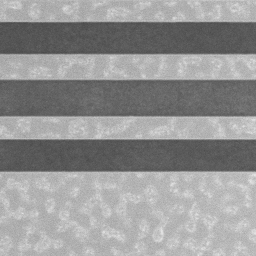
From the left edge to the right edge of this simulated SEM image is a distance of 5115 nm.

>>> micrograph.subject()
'parallel lines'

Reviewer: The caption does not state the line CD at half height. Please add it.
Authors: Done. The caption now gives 0.494 um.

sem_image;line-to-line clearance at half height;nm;639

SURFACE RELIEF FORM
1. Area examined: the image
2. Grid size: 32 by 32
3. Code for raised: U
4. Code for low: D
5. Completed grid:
UUUUUUUUUUUUUUUUUUUUUUUUUUUUUUUU
UUUUUUUUUUUUUUUUUUUUUUUUUUUUUUUU
UUUUUUUUUUUUUUUUUUUUUUUUUUUUUUUU
DDDDDDDDDDDDDDDDDDDDDDDDDDDDDDDD
DDDDDDDDDDDDDDDDDDDDDDDDDDDDDDDD
DDDDDDDDDDDDDDDDDDDDDDDDDDDDDDDD
DDDDDDDDDDDDDDDDDDDDDDDDDDDDDDDD
UUUUUUUUUUUUUUUUUUUUUUUUUUUUUUUU
UUUUUUUUUUUUUUUUUUUUUUUUUUUUUUUU
UUUUUUUUUUUUUUUUUUUUUUUUUUUUUUUU
DDDDDDDDDDDDDDDDDDDDDDDDDDDDDDDD
DDDDDDDDDDDDDDDDDDDDDDDDDDDDDDDD
DDDDDDDDDDDDDDDDDDDDDDDDDDDDDDDD
DDDDDDDDDDDDDDDDDDDDDDDDDDDDDDDD
DDDDDDDDDDDDDDDDDDDDDDDDDDDDDDDD
UUUUUUUUUUUUUUUUUUUUUUUUUUUUUUUU
UUUUUUUUUUUUUUUUUUUUUUUUUUUUUUUU
DDDDDDDDDDDDDDDDDDDDDDDDDDDDDDDD
DDDDDDDDDDDDDDDDDDDDDDDDDDDDDDDD
DDDDDDDDDDDDDDDDDDDDDDDDDDDDDDDD
DDDDDDDDDDDDDDDDDDDDDDDDDDDDDDDD
UUDDDDDDDDDUUUDUUUUUUUUUUUUUUUUU
UUUUUUUUUUUUUUUUUUUUUUUUUUUUUUUU
UUUUUUUUUUUUUUUUUUUUUUUUUUUUUUUU
UUUUUUUUUUUUUUUUUUUUUUUUUUUUUUUU
UUUUUUUUUUUUUUUUUUUUUUUUUUUUUUUU
UUUUUUUUUUUUUUUUUUUUUUUUUUUUUUUU
UUUUUUUUUUUUUUUUUUUUUUUUUUUUUUUU
UUUUUUUUUUUUUUUUUUUUUUUUUUUUUUUU
UUUUUUUUUUUUUUUUUUUUUUUUUUUUUUUU
UUUUUUUUUUUUUUUUUUUUUUUUUUUUUUUU
UUUUUUUUUUUUUUUUUUUUUUUUUUUUUUUU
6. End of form